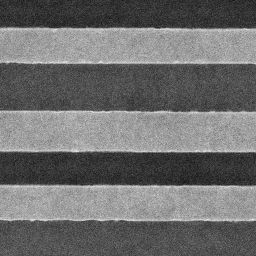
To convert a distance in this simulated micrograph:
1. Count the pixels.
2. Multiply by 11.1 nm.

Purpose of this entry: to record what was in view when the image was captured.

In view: lines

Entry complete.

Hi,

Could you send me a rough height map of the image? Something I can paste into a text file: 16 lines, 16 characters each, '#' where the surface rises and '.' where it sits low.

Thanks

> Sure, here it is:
................
................
################
################
................
................
................
################
################
................
................
................
################
################
................
................